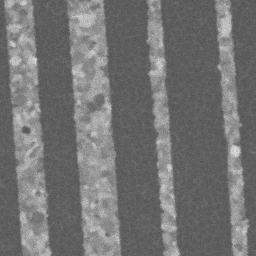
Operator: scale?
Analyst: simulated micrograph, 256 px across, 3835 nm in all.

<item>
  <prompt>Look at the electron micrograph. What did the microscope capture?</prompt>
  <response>one or a few lines or trenches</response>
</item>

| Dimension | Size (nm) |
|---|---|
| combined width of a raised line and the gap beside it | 1020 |